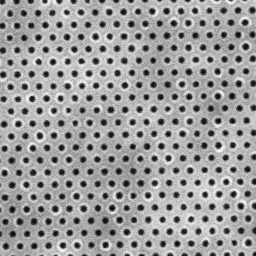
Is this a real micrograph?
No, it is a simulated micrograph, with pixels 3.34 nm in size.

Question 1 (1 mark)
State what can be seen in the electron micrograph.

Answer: a regular array of holes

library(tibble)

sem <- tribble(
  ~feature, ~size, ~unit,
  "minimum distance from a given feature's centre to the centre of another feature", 46.1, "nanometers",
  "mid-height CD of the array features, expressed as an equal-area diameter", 21.7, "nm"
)